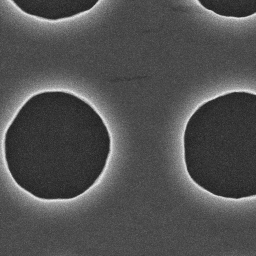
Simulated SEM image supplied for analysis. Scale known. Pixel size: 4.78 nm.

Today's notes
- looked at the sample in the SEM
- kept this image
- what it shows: holes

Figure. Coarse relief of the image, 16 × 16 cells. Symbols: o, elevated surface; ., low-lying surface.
o.....ooooooo...
oooooooooooooooo
oooooooooooooooo
oooooooooooooooo
oooooooooooooooo
oooooooooooooooo
oo....ooooooo...
o.....oooooo....
.......ooooo....
.......ooooo....
o......ooooo....
o.....oooooo....
oooooooooooooooo
oooooooooooooooo
oooooooooooooooo
oooooooooooooooo